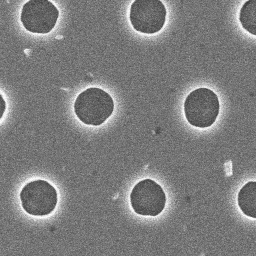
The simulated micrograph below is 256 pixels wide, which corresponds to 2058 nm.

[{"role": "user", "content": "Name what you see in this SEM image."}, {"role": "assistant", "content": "holes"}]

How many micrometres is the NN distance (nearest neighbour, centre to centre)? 0.85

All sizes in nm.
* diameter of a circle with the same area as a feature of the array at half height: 304